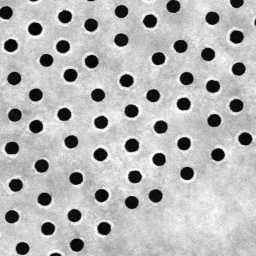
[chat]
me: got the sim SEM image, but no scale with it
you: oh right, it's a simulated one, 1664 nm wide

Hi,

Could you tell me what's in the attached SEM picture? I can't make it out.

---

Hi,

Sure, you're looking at a regular array of holes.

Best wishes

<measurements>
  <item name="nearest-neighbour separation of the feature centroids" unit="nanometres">185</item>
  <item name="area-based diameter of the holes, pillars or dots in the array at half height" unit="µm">0.0867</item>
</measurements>